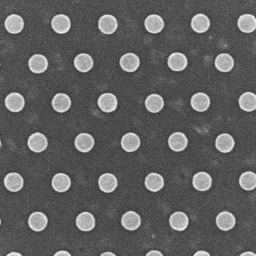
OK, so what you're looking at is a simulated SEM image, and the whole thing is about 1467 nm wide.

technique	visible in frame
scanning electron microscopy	a regular array of raised bodies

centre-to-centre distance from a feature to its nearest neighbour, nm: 258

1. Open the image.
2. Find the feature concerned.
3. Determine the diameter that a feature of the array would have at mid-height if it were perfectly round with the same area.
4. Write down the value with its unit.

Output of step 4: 106 nm